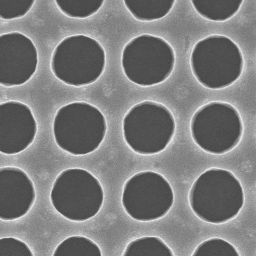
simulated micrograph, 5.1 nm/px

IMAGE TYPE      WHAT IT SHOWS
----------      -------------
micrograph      a regular array of holes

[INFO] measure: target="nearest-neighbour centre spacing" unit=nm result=345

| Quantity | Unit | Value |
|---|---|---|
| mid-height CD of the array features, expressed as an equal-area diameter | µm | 0.259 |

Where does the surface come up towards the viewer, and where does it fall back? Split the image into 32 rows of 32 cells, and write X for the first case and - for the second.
----XXX------XXX------XX------XX
---XXXXX----XXXX-----XXXX----XXX
XXXXXXXXXXXXXXXXXX-XXXXXXXX-XXXX
XXXXXXXXXXXXXXXXXXXXXXXXXXXXXXXX
---XXXXXXXXXXXXXXX-XXXXXXXXXXXXX
----XXXX----XXXX-----XXXX----XXX
-----XX------XX-------XX------XX
-----XX------XX-------XX------XX
----XXX------XX-------XX------XX
----XXX-----XXXX-----XXXX-----XX
---XXXXXX--XXXXXX--XXXXXX----XXX
XXXXXXXXXXXXXXXXXXXXXXXXXXXXXXXX
XXXXXXXXXXXXXXXXXXXXXXXXXXXXXXXX
---XXXXX----XXXXX----XXXXX---XXX
----XXX------XXX-----XXX------XX
----XXX------XXX------XX------XX
----XXX------XX-------XX------XX
----XXX------XXX-----XXX------XX
---XXXXX----XXXXX---XXXXX----XXX
XXXXXXXXXXXXXXXXXXXXXXXXXXXXXXXX
XXXXXXXXXXXXXXXXXXXXXXXXXXXXXXXX
---XXXXX---XXXXXXXXXXXXXXX---XXX
----XXX-----XXXX-----XXXX-----XX
----XXX------XXX-----XXX------XX
----XX-------XX-------XX------XX
----XXX------XX------XXX------XX
---XXXX-----XXXX-----XXX------XX
XXXXXXXXX-XXXXXXXX-XXXXXXX--XXXX
XXXXXXXXXXXXXXXXXXXXXXXXXXXXXXXX
XXXXXXXXXXXXXXXXXXXXXXXXXXXXXXXX
---XXXXX----XXXX----XXXXX----XXX
----XXX-----XXXX-----XXX------XX